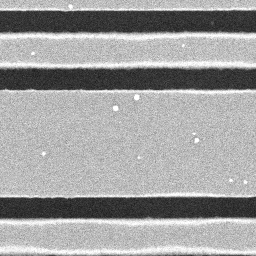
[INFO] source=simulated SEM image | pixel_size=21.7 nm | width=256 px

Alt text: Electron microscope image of lines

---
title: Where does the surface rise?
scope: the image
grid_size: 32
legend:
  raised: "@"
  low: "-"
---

@@@@@@@@@@@@@@@@@@@@@@@@@@@@@@@@
--------------------------------
--------------------------------
--------------------------------
@@@@@@@@@@@@@@@@@@@@@@@@@@@@@@@@
@@@@@@@@@@@@@@@@@@@@@@@@@@@@@@@@
@@@@@@@@@@@@@@@@@@@@@@@@@@@@@@@@
@@@@@@@@@@@@@@@@@@@@@@@@@@@@@@@@
--------------------------------
--------------------------------
--------------------------------
@@@@@@@@@@@@@@@@@@@@@@@@@@@@@@@@
@@@@@@@@@@@@@@@@@@@@@@@@@@@@@@@@
@@@@@@@@@@@@@@@@@@@@@@@@@@@@@@@@
@@@@@@@@@@@@@@@@@@@@@@@@@@@@@@@@
@@@@@@@@@@@@@@@@@@@@@@@@@@@@@@@@
@@@@@@@@@@@@@@@@@@@@@@@@@@@@@@@@
@@@@@@@@@@@@@@@@@@@@@@@@@@@@@@@@
@@@@@@@@@@@@@@@@@@@@@@@@@@@@@@@@
@@@@@@@@@@@@@@@@@@@@@@@@@@@@@@@@
@@@@@@@@@@@@@@@@@@@@@@@@@@@@@@@@
@@@@@@@@@@@@@@@@@@@@@@@@@@@@@@@@
@@@@@@@@@@@@@@@@@@@@@@@@@@@@@@@@
@@@@@@@@@@@@@@@@@@@@@@@@@@@@@@@@
@@@@@@@@@@@@@@@@@@@@@@@@@@@@@@@@
--------------------------------
--------------------------------
@@@@@@@@@@@@@@@@@@@@@@@@@@@@@@@@
@@@@@@@@@@@@@@@@@@@@@@@@@@@@@@@@
@@@@@@@@@@@@@@@@@@@@@@@@@@@@@@@@
@@@@@@@@@@@@@@@@@@@@@@@@@@@@@@@@
@@@@@@@@@@@@@@@@@@@@@@@@@@@@@@@@